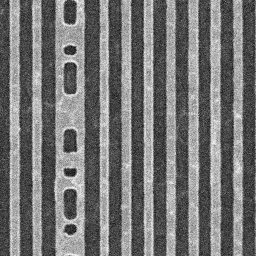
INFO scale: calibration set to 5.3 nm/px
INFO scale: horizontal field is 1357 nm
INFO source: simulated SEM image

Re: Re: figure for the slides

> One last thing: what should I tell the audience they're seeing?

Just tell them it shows parallel lines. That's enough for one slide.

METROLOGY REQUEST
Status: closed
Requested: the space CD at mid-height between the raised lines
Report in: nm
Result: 74.3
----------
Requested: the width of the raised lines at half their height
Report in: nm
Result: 42.4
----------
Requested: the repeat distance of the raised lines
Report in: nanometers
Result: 118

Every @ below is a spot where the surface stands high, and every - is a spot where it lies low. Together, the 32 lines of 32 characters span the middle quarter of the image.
---@@----@@----@@---@@----@@---@
---@@----@@----@@---@@----@@---@
---@@----@@----@@---@@----@@---@
---@@----@@----@@---@@----@@---@
---@@----@@----@@---@@----@@---@
---@@----@@----@@---@@----@@---@
---@@----@@----@@---@@----@@---@
---@@----@@----@@---@@----@@---@
@@@@@----@@----@@---@@----@@---@
@@@@@----@@----@@---@@----@@---@
@@@@@----@@----@@---@@----@@---@
@@@@@----@@----@@---@@----@@---@
@@@@@----@@----@@---@@----@@---@
@@@@@----@@----@@---@@----@@---@
@@@@@----@@----@@---@@----@@---@
@@@@@----@@----@@---@@----@@---@
---@@----@@----@@---@@----@@---@
---@@----@@----@@---@@----@@---@
---@@----@@----@@---@@----@@---@
---@@----@@----@@---@@----@@---@
---@@----@@----@@---@@----@@---@
---@@----@@----@@---@@----@@---@
@@@@@----@@----@@---@@----@@---@
@@@@@----@@----@@---@@----@@---@
@@@@@----@@----@@---@@----@@---@
@@@@@----@@----@@---@@----@@---@
---@@----@@----@@---@@----@@---@
---@@----@@----@@---@@----@@---@
@@@@@----@@----@@---@@----@@---@
@@@@@----@@----@@---@@----@@---@
@@@@@----@@----@@---@@----@@---@
---@@----@@----@@---@@----@@---@